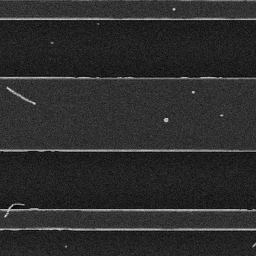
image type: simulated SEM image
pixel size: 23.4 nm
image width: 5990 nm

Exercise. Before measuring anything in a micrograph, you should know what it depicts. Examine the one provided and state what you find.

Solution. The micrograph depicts lines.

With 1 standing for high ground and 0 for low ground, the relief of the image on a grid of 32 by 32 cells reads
11111111111111111111111111111111
11111111111111111111111111111111
00000000000000000000000000000000
00000000000000000000000000000000
00000000000000000000000000000000
00000000000000000000000000000000
00000000000000000000000000000000
00000000000000000000000000000000
00000000000000000000000000000000
00000000000000000000000000000000
11111111111111111111111111111111
11111111111111111111111111111111
11111111111111111111111111111111
11111111111111111111111111111111
11111111111111111111111111111111
11111111111111111111111111111111
11111111111111111111111111111111
11111111111111111111111111111111
11111111111111111111111111111111
00000000000000000000000000000000
00000000000000000000000000000000
00000000000000000000000000000000
00000000000000000000000000000000
00000000000000000000000000000000
00000000000000000000000000000000
00000000000000000000000000000000
11111111111111111111111111111111
11111111111111111111111111111111
11111111111111111111111111111111
00000000000000000000000000000000
00000000000000000000000000000000
00000000000000000000000000000000